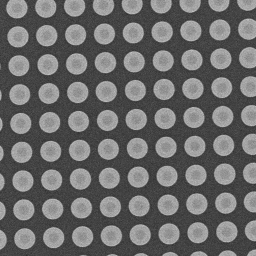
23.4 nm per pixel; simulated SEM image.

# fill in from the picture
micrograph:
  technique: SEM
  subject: an array of small figures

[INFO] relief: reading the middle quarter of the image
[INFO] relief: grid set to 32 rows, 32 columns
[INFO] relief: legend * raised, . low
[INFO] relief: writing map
.*****..*****..*****...****...**
.****....***....***.....**......
................................
................................
..........*.....***....****...**
.****...*****...****...****...**
.*****..*****..*****...*****..**
.*****..*****..*****...****...**
.*****...****...****....**.....*
..**............................
................................
.................**.....***....*
..***....****...****...*****..**
.*****..*****...*****..*****..**
.*****..*****...*****..*****..**
.*****...****...****....***....*
..***.....**....................
................................
........................***....*
..***....****...****...*****..**
..****...****...*****..*****..**
.*****...*****..*****..*****..**
..****...****...****....***....*
..****....**......*.............
................................
................................
...**.....***....***....****...*
..****...*****..*****..*****...*
..*****..*****..*****..*****...*
..*****..*****..*****...****...*
..****....***....***............
................................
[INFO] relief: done